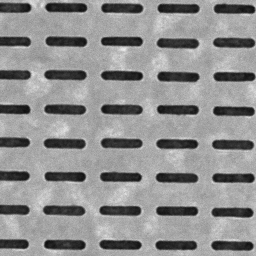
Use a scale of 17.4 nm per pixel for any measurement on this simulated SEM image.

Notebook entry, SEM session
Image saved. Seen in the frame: a regular array of holes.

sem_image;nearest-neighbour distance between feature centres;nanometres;582